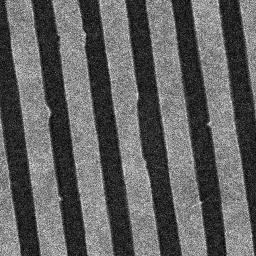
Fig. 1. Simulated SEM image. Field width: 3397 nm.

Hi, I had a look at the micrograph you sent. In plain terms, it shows parallel lines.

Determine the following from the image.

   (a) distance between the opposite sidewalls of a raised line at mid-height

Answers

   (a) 356 nm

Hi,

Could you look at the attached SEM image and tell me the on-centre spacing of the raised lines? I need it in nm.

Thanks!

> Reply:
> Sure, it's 613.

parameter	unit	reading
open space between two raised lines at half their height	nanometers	256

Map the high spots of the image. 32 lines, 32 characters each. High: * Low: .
.***...***..****..****..***...**
.***...***..****..****..****..**
.***...***...***..****..****..**
.***...***...***...***..****..**
.****..****..***...***..****..**
.****..****..***...***...***...*
.****..****..****..***...***...*
..***...***..****..****..***...*
..***...***...***..****..****..*
..***...***...***..****..****..*
..****..***...***...***..****..*
..****..***...***...***...***..*
..****..****..***...***...***...
...***..****..***...***...***...
...***...***..***...****..***...
...***...***..***...****..****..
...***...***...**...****..****..
*..***...***...***..****...***..
*..****..***...***...***...***..
*..****..****..***...***...***..
*...***..****..***...***...***..
*...***..****..***...****..***..
*...***...***..****..****..****.
*...***...***...***..****..****.
**..****..***...***..****...***.
**..****..***...***...***...***.
**..****..***...***...***...***.
**..****..****..***...****..***.
**...***..****..****..****..***.
**...***...***..****..****..****
***..***...***...***..****..****
***..***...***...***...***..****